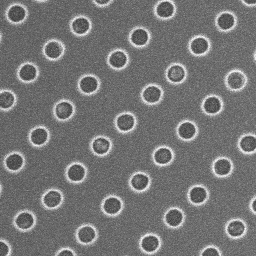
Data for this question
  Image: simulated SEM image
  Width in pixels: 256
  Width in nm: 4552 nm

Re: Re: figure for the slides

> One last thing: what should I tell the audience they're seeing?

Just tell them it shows a regular array of holes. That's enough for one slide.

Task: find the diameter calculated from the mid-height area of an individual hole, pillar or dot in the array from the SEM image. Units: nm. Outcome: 309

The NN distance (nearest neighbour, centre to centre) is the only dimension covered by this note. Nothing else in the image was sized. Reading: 626 nm